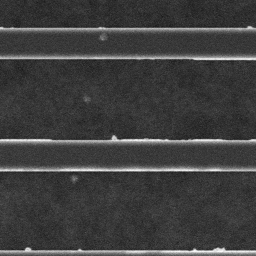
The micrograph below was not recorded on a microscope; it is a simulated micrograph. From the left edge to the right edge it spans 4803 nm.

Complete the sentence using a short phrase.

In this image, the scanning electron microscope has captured lines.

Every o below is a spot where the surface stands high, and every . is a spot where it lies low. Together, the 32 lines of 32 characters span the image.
................................
................................
................................
................................
oooooooooooooooooooooooooooooooo
oooooooooooooooooooooooooooooooo
oooooooooooooooooooooooooooooooo
................................
................................
................................
................................
................................
................................
................................
................................
................................
................................
.ooooo.........ooo.o....oo......
oooooooooooooooooooooooooooooooo
oooooooooooooooooooooooooooooooo
oooooooooooooooooooooooooooooooo
................................
................................
................................
................................
................................
................................
................................
................................
................................
................................
ooooooooooooooooooooooo.oo.oooo.